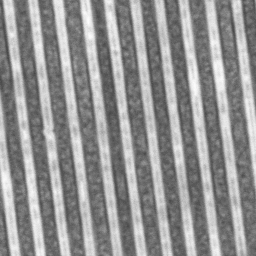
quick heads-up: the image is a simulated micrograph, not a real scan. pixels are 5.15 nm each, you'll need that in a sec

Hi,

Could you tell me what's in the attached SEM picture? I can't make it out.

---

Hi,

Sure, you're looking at parallel lines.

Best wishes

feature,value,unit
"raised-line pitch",0.129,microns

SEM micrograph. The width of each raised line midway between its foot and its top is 0.0453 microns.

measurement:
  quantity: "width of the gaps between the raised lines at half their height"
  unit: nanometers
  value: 82.4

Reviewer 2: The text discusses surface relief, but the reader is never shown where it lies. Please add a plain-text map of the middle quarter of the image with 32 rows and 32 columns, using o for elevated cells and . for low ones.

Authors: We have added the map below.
o.....ooo...oo.....oo....oo....o
oo....ooo...ooo....oo....oo....o
oo.....oo...ooo....oo....oo....o
oo.....oo...ooo....oo....oo....o
oo.....oo....oo....oo....oo....o
oo.....oo....oo....ooo...ooo...o
oo.....oo....oo.....oo....oo....
ooo....oo....oo.....oo....oo....
.oo....ooo...oo.....oo....oo....
.oo....ooo...ooo....oo....oo....
.oo.....oo....oo....oo....oo....
.oo.....oo....oo....oo....oo....
.oo.....oo....oo....oo....oo....
.oo.....oo....oo....ooo...ooo...
.oo.....oo....oo.....oo....oo...
..oo....ooo...oo.....oo....oo...
..oo....ooo...oo.....oo....oo...
..oo....ooo...ooo....oo....oo...
..oo.....oo....oo....oo....oo...
..oo.....oo....oo....oo....oo...
..oo.....oo....oo....oo....oo...
..oo.....oo....oo....oo.....oo..
..oo.....oo....oo.....o.....oo..
...oo....oo....oo.....oo....oo..
...oo....oo....oo.....oo....oo..
...oo....ooo....o.....oo....oo..
...oo.....oo....oo....oo....oo..
...oo.....oo....oo....oo....oo..
...oo.....oo....oo....oo....oo..
...oo.....oo....oo.....o.....oo.
...ooo....oo....oo.....o.....oo.
....oo....oo....oo.....oo....oo.